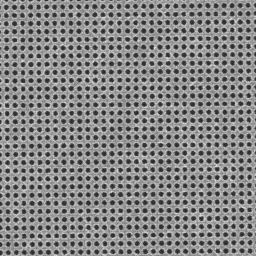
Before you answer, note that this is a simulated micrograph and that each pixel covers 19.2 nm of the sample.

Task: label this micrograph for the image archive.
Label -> a regular array of holes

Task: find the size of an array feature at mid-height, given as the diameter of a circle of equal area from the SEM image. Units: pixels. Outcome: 5.47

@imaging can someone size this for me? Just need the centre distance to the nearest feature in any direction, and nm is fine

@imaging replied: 149